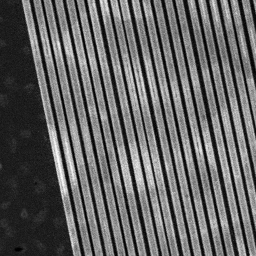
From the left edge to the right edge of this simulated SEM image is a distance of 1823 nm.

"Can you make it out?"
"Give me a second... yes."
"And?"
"parallel lines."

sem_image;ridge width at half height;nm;48.9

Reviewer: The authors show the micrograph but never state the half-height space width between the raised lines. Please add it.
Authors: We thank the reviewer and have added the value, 30.5 nm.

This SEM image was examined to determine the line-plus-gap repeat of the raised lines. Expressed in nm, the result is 76.7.